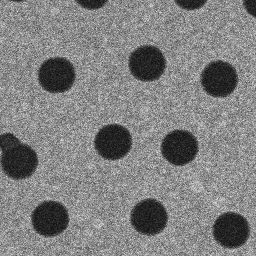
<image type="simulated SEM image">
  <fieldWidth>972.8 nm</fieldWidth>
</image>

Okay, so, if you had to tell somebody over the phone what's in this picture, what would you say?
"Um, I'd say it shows a regular array of holes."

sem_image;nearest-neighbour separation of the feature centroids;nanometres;284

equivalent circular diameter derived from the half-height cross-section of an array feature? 134 nanometers